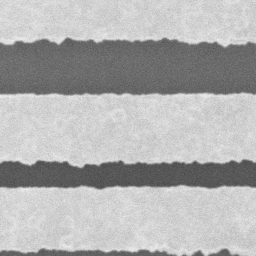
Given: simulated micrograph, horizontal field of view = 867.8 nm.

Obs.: lines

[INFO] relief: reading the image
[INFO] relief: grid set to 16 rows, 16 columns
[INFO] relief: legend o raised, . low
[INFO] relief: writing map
oooooooooooooooo
oooooooooooooooo
oo...o..o...ooo.
................
................
................
oooooooooooooooo
oooooooooooooooo
oooooooooooooooo
oooooooooooooooo
................
................
oooooooooooooooo
oooooooooooooooo
oooooooooooooooo
oooooooooooooooo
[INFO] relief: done